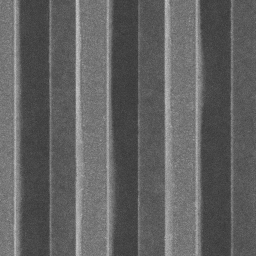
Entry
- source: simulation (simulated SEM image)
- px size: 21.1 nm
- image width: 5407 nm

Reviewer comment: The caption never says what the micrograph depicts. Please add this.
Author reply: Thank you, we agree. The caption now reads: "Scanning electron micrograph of lines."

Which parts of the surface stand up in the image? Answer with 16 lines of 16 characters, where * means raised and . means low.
*..****..***...*
*..****..***...*
*..****..***...*
*..****..***...*
*..****..***...*
*..****..***...*
*..****..***...*
*..****..***...*
*..****..***...*
*..****..***...*
*..****..***...*
*..****..***...*
*..****..***...*
*..****..***...*
*..****..***...*
*..****..***...*